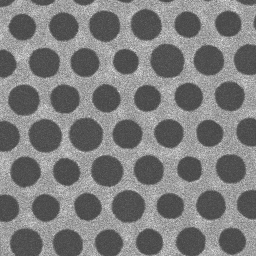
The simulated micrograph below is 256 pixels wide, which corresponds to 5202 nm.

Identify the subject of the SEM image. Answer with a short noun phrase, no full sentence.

a regular array of holes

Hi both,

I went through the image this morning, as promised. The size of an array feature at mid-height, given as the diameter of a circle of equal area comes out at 607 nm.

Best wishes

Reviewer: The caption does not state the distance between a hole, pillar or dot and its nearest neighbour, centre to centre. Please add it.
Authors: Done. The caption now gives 0.831 microns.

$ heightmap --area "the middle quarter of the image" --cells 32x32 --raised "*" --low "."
**.......***.......***........**
**......*****.....****........**
***.....******...******......***
*************************..*****
********************************
..*******...*******...*******...
...*****.....*****......****....
....***.......****......****....
....***.......***.......***.....
....***.......***.......****....
....***.......****......****....
...******....******...********..
.*******************************
*****..*************************
***.....******....******....****
**.......****......****.......**
*.........**........***.......**
*.........**........**........**
*.........**........***.......**
**.......***.......****......***
**.......*****....******....****
****....************************
********************************
.*******.....******....*******..
...****.......****......*****...
....***........**........***....
....***........**........***....
....***........***.......***....
....***........***.......****...
...*****......*****.....*******.
*********...********************
***************.****************